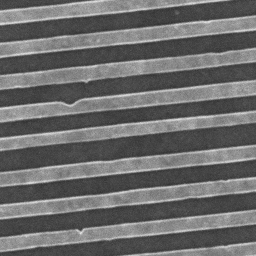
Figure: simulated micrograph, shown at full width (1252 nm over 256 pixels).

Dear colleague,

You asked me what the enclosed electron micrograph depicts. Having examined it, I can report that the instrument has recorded parallel lines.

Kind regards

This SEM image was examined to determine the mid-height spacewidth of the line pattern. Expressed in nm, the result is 91.7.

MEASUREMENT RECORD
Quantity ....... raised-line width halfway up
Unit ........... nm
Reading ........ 64.4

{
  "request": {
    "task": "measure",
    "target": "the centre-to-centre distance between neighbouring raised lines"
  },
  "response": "157 nanometres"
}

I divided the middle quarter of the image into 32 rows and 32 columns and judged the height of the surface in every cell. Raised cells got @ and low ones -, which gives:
--------@@@@@@@@@@@@@@@@@@@@@@@@
@@@@@@@@@@@@@@@@@@@@@@@@@@@@----
@@@@@@@@@@@@@@@@@@@-------------
@@@@@@@@@@----------------------
@-------------------------------
--------------------------------
---------------------------@@@@@
------------------@@@@@@@@@@@@@@
---------@@@@@@@@@@@@@@@@@@@@@@@
---@@@@@@@@@@@@@@@@@@@@@@@@@@---
@@@@@@@@@@@@@@@@@@@-------------
@@@@@@@@@@----------------------
@-------------------------------
--------------------------------
-----------------------@@@@@@@@@
------------@@@@@@@@@@@@@@@@@@@@
-----@@@@@@@@@@@@@@@@@@@@@@@@---
@@@@@@@@@@@@@@@@@@@@------------
@@@@@@@@@@@---------------------
@@------------------------------
--------------------------------
--------------------------------
------------------------------@@
------------------@@@@@@@@@@@@@@
---------@-@@@@@@@@@@@@@@@@@@@@@
@@@@@@@@@@@@@@@@@@@@@@@@@@@@@@@-
@@@@@@@@@@@@@@@@@@@@@@----------
@@@@@@@@@@----------------------
@@------------------------------
--------------------------------
-----------------------------@@@
-------------------@@@@@@@@@@@@@